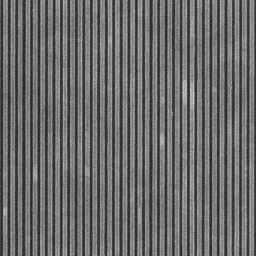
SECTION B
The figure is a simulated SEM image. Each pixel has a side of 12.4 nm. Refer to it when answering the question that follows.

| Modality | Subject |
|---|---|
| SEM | parallel lines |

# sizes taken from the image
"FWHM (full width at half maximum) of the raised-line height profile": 55.8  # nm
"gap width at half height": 45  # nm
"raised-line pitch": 92.6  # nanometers